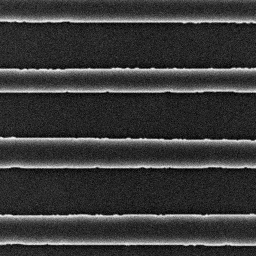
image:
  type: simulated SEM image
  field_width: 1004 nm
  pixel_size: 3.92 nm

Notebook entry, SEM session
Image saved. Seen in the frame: lines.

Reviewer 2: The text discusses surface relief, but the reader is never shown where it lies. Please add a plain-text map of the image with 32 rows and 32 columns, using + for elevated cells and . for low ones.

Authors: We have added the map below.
++++++++++++++++++++++++++++++++
++++++++++++++++++++++++++++++++
++++++++++++++++++++++++++++++++
................................
................................
................................
................................
................................
................................
++++++++++++++++++++++++++++++++
++++++++++++++++++++++++++++++++
...+............................
................................
................................
................................
................................
................................
++++++++++++++++++++++++.++++...
++++++++++++++++++++++++++++++++
++++++++++++++++++++++++++++++++
++++++++++++++++++++++++++++++++
................................
................................
................................
................................
................................
................................
++++++++++++++++++++++++++++++++
++++++++++++++++++++++++++++++++
++++++++++++++++++++++++++++++++
++++++++++++++++++++++++++++++++
................................